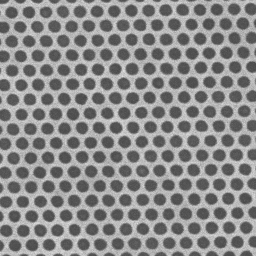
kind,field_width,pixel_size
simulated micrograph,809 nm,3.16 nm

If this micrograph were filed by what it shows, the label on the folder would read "a regular array of holes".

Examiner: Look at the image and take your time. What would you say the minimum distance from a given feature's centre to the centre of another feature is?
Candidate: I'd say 52.2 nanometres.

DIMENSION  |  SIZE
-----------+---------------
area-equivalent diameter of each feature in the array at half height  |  12.4 pixels